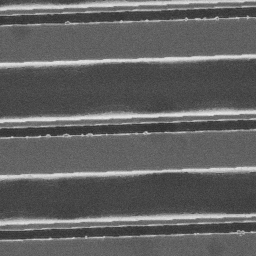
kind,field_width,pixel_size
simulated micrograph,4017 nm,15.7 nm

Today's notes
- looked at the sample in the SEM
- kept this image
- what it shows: lines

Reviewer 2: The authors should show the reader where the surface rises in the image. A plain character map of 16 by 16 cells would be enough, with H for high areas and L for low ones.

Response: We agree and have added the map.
LLHHHHHHHHHHHHHH
HHHHHHHHHHHHHHHH
HHHHHHHHHHHHHHHH
HHHHHHHHHHHHHHLL
LLLLLLLLLLLLLLLL
LLLLLLLLLLLLLLLL
LLLLLLLLLLLLLLLL
LLLLHHHHHHHHHHHH
HHHHHHHHHHHHHHHH
HHHHHHHHHHHHHHHH
HHHHHHHHHHHHHHLL
LLLLLLLLLLLLLLLL
LLLLLLLLLLLLLLLL
LLLLLLLLLLLLLLLL
HHHHHHHHHHHHHHHH
HHHHHHHHHHHHHHHH